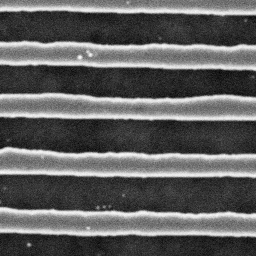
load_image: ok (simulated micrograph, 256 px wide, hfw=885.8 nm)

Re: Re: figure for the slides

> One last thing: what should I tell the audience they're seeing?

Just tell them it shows lines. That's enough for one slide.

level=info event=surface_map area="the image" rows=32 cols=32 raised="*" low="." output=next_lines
********************************
..............***.**.***********
................................
................................
................................
***********.....................
********************************
********************************
.....................***********
................................
................................
................................
********************************
********************************
********************************
................................
................................
................................
.*..............................
********************************
********************************
********************************
................................
................................
................................
................................
**********....*..**.............
********************************
********************************
...............................*
................................
................................